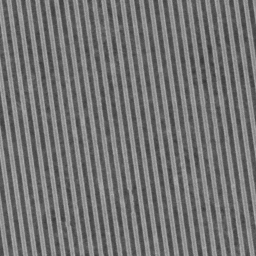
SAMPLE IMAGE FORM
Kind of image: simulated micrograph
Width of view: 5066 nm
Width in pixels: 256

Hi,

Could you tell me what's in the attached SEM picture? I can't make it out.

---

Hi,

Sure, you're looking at parallel lines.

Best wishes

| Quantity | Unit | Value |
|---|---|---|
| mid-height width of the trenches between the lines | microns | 0.113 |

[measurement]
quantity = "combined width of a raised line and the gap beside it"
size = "0.185 um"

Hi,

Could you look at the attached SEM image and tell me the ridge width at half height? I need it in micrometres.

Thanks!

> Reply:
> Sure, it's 0.0735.